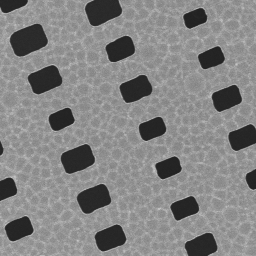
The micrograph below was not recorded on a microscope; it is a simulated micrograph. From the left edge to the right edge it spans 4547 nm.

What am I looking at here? a regular array of holes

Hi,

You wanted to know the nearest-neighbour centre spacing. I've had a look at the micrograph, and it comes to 761 nm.